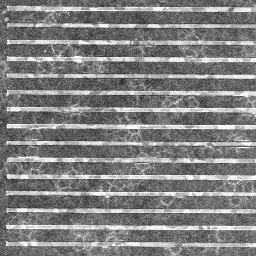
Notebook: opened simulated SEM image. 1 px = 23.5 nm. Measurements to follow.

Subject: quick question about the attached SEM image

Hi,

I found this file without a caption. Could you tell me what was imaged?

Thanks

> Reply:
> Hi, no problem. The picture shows parallel lines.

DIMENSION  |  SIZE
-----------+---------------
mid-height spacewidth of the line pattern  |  312 nm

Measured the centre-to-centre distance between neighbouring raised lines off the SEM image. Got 396 nm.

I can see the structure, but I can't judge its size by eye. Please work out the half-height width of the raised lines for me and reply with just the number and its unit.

85.3 nanometres